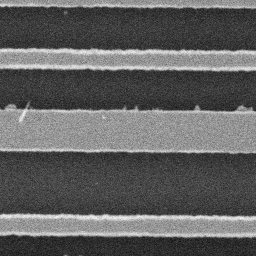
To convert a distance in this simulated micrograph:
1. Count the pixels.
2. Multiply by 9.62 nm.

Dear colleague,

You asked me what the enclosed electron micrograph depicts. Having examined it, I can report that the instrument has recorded lines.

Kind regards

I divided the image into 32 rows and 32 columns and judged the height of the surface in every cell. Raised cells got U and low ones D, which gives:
UUUUUUUUUUUUUUUUUUUUUUUUUUUUUUUU
DDDDDDDDDDDDDDDDDDDDDDDDDDDDDDDD
DDDDDDDDDDDDDDDDDDDDDDDDDDDDDDDD
DDDDDDDDDDDDDDDDDDDDDDDDDDDDDDDD
DDDDDDDDDDDDDDDDDDDDDDDDDDDDDDDD
DDDDDDDDDDDDDDDDDDDDDDDDDDDDDDDD
UUUUUUUUUUUUUUUUUUUUUUUUUUUUUUUU
UUUUUUUUUUUUUUUUUUUUUUUUUUUUUUUU
DDDDDDDDDDDDDDUDUDUUUUUUUUUUUUUU
DDDDDDDDDDDDDDDDDDDDDDDDDDDDDDDD
DDDDDDDDDDDDDDDDDDDDDDDDDDDDDDDD
DDDDDDDDDDDDDDDDDDDDDDDDDDDDDDDD
DDDDDDDDDDDDDDDDDDDDDDDDDDDDDDDD
DDDDDDDDDDDDDDDDDDDDDDDDDDDDDDDD
UUUUUUUUUUUUUUUUUUUUUUUUUUUUUUUU
UUUUUUUUUUUUUUUUUUUUUUUUUUUUUUUU
UUUUUUUUUUUUUUUUUUUUUUUUUUUUUUUU
UUUUUUUUUUUUUUUUUUUUUUUUUUUUUUUU
UUUUUUUUUUUUUUUUUUUUUUUUUUUUUUUU
DDDDDDDDDDDDDDDDDDDDDDDDDDDDDDDD
DDDDDDDDDDDDDDDDDDDDDDDDDDDDDDDD
DDDDDDDDDDDDDDDDDDDDDDDDDDDDDDDD
DDDDDDDDDDDDDDDDDDDDDDDDDDDDDDDD
DDDDDDDDDDDDDDDDDDDDDDDDDDDDDDDD
DDDDDDDDDDDDDDDDDDDDDDDDDDDDDDDD
DDDDDDDDDDDDDDDDDDDDDDDDDDDDDDDD
DDDDDDDDDDDDDDDDDDDDDDDDDDDDDDDD
UUUUUUUUUUUUUUUUUUUUUUUUUUUUUUUU
UUUUUUUUUUUUUUUUUUUUUUUUUUUUUUUU
DDDDDDDDDDDDDDDDDDDDDDDDDDDDDDDD
DDDDDDDDDDDDDDDDDDDDDDDDDDDDDDDD
DDDDDDDDDDDDDDDDDDDDDDDDDDDDDDDD